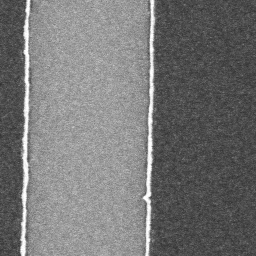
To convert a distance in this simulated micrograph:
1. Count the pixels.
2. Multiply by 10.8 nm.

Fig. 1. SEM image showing one or a few lines or trenches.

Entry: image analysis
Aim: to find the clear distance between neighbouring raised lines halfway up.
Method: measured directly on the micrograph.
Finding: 1330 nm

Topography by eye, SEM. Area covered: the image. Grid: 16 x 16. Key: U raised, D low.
UUDDDDDDDUUUUUUU
UUDDDDDDDUUUUUUU
UUDDDDDDDUUUUUUU
UUDDDDDDDUUUUUUU
UUDDDDDDDUUUUUUU
UUDDDDDDDUUUUUUU
UUDDDDDDDUUUUUUU
UUDDDDDDDUUUUUUU
UUDDDDDDDUUUUUUU
UUDDDDDDDUUUUUUU
UUDDDDDDDUUUUUUU
UUDDDDDDDUUUUUUU
UUDDDDDDDUUUUUUU
UUDDDDDDDUUUUUUU
UDDDDDDDDUUUUUUU
UUDDDDDDDUUUUUUU